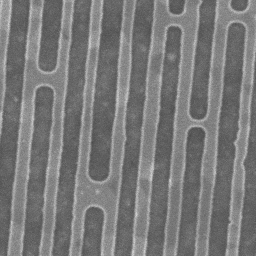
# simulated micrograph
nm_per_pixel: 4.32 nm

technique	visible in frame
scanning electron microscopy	parallel lines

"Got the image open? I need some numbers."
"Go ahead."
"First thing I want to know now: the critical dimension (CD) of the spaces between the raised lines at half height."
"19.5 pixels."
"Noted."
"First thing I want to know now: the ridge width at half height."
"48.9 nm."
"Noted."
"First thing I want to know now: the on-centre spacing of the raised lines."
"0.133 microns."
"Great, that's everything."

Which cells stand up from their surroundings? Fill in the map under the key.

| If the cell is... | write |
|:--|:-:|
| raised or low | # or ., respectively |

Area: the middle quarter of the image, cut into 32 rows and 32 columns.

#.....##......###....###.....###
#.....##......##.....###.....###
#.....##......##.....###.....###
#.....##......##.....###.....###
......#.......##.....###.....###
.....##.......##.....###.....###
.....##.......##.....###.....##.
.....##......###.....###.....##.
.....##......###.....###....###.
.....##......##.....####....###.
.....##......##.....####....###.
.....##......##.....####....###.
.....##......##.....###.....###.
.....##......##.....####....####
.....##......##.....###.....####
.....##......##.....###.....####
....###.....###.....###.....###.
....###.....###.....###.....##..
....##......###.....###.....##..
....###.....###....####....###..
....##......###....###.....###..
....##......###....####....###..
....##......###....###.....###..
....##......###....###.....###..
....##......##.....###.....###..
....##......##.....###.....###..
...###......##.....###.....###..
...###......##.....###.....###..
...###.....###.....###.....##...
...#####..####.....###.....##...
...###########....####....###...
...###########....###.....###...